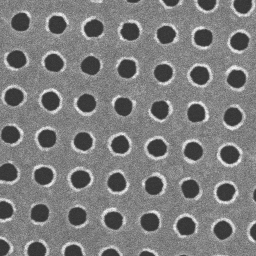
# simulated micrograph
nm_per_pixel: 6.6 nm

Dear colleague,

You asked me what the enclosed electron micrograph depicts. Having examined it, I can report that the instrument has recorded a regular array of holes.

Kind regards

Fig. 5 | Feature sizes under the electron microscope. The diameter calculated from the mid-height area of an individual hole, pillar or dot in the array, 123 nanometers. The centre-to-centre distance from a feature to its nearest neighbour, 36.4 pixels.